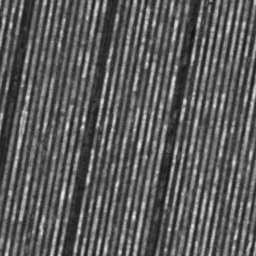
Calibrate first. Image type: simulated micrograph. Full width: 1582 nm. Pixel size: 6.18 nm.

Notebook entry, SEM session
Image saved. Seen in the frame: parallel lines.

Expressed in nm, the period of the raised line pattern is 45.8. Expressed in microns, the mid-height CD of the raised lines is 0.0174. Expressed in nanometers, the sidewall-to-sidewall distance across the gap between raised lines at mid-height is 26.6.